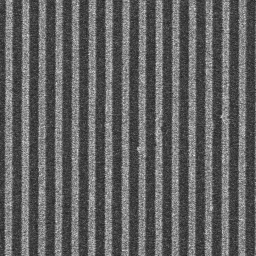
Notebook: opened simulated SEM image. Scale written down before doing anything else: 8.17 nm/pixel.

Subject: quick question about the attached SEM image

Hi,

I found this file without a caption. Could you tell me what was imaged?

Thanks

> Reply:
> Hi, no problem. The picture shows parallel lines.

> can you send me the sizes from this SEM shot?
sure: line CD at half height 55.1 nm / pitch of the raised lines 136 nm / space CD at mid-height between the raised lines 86.8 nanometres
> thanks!